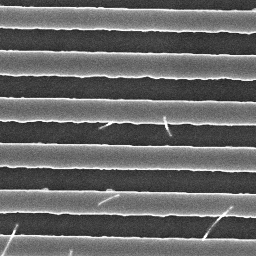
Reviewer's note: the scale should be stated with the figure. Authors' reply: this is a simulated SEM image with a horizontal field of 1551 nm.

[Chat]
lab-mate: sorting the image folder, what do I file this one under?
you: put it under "lines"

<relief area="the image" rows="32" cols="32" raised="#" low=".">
................................
################################
################################
.###############################
................................
................................
#######..#......................
################################
################################
.........###.###################
................................
................................
##############..................
################################
################################
....................#...##.#####
................................
................................
################################
################################
################################
................................
................................
................................
################################
################################
################################
................................
................................
######..........................
################################
################################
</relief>